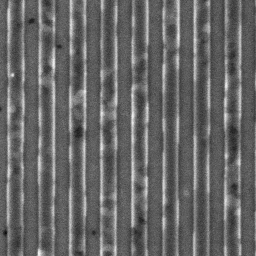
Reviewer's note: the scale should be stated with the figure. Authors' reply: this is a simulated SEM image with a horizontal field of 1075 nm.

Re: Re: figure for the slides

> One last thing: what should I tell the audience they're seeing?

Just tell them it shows wiring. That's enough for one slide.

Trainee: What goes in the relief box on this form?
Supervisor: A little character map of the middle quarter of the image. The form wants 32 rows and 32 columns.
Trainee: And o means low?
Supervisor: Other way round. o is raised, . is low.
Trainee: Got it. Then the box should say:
.ooooo...oooo....oooo....oooo...
.ooooo...oooo....oooo....oooo...
.oooo....oooo....oooo....oooo...
.oooo....oooo....oooo....oooo...
.oooo....oooo....oooo....oooo...
.oooo....oooo....oooo....oooo...
.oooo....oooo....oooo....oooo...
.oooo....oooo....oooo....oooo...
.oooo....oooo....oooo....oooo...
.oooo....oooo....oooo....oooo...
.oooo....oooo....oooo....oooo...
.oooo....oooo....oooo....oooo...
.oooo....oooo....oooo....oooo...
.oooo....oooo....oooo....oooo...
.oooo....oooo....oooo....oooo...
.oooo....oooo....oooo....oooo...
.oooo....oooo....oooo....oooo...
.oooo....oooo....oooo....oooo...
.oooo....oooo....oooo....oooo...
.oooo....oooo....oooo....oooo...
.oooo....oooo....oooo....oooo...
.oooo....oooo....oooo....oooo...
.oooo....oooo....oooo....oooo...
.oooo....oooo....oooo....oooo...
.oooo....oooo....oooo....oooo...
.oooo....oooo....oooo....ooo....
.oooo....oooo....oooo....oooo...
.oooo....oooo....oooo....oooo...
.oooo....oooo....oooo....oooo...
.oooo....oooo....oooo....oooo...
.oooo....oooo....oooo....oooo...
.oooo....oooo....oooo....oooo...